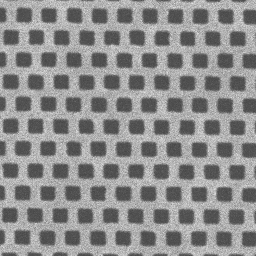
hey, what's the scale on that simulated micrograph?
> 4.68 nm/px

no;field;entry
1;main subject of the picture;a regular array of holes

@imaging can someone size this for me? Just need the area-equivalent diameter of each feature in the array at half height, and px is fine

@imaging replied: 16.8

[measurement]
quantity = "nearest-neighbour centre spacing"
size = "25 px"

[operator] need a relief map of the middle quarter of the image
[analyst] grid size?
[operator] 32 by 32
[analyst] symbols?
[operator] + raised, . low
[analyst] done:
+...+++....++....+++...+++...+++
++++++++++++++++++++++++++++++++
++++++++++++++++++++++++++++++++
.+++....++....++....+++...+++...
.+++....++....++....+++....++...
.+++....++....++....+++....++...
.+++...++++..++++..++++...+++...
++++++++++++++++++++++++++++++++
+...+++...++++..++++...+++...+++
....+++....++....++....+++....++
....+++....++....++....+++....++
+...+++....++....++....+++....++
++++++++++++++++++++++++++++++++
++++++++++++++++++++++++++++++++
.++....+++....++....+++...+++...
.++.....++....++....++....+++...
.+++....++....++....++....+++...
.+++++++++....+++...+++...+++...
++++++++++++++++++++++++++++++++
+...+++...++++..++++..++++...+++
+...+++....++....++....+++....++
+...+++....++....++....+++....++
+...+++....++....++....+++....++
++++++++++++++++++++++++++++++++
++++++++++++++++++++++++++++++++
.+++...+++....++....++....+++...
.++....+++....++....++....+++...
.++.....++....++....++....+++...
.+++...+++...++++...+++...+++...
++++++++++++++++++++++++++++++++
+...+++...+++...++++.+++++++++++
....++.....++....++....++....+++